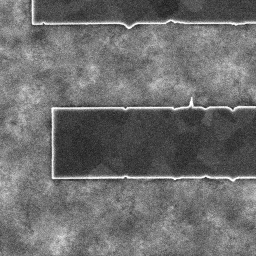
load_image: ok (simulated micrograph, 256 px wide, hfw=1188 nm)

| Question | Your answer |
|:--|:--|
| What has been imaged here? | one or a few lines or trenches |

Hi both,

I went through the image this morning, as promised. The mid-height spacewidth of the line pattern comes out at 0.387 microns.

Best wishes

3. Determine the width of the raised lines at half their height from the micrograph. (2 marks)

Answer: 329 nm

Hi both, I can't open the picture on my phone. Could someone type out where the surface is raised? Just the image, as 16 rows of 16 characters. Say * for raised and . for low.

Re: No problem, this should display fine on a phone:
..**************
..*....**.....*.
................
................
................
................
................
...*************
...*************
...*************
...*************
................
................
................
................
................